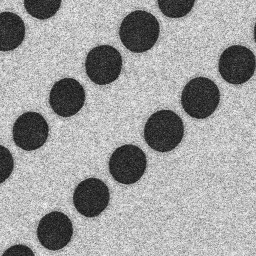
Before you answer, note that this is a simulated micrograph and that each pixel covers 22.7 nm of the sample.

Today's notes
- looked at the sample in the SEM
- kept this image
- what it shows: a regular array of holes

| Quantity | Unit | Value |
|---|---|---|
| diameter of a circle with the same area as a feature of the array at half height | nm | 886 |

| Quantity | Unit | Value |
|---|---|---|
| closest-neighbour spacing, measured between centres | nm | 1110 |